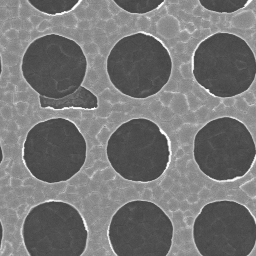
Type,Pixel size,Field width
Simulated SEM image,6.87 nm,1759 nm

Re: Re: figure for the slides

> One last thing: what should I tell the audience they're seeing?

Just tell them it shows holes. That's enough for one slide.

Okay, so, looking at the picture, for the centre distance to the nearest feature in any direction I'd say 548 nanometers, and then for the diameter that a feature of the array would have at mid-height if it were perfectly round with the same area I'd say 438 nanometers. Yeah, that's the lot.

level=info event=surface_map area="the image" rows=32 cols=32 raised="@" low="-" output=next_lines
@@@@-----@@@@@@-----@@@@@------@
@@@@@---@@@@@@@@---@@@@@@@@--@@@
@@@@@@@@@@@@@@@@@@@@@@@@@@@@@@@@
@@@@@@@@@@@@@@@@@@@@@@@@@@@@@@@@
@@@@@@--@@@@@@@@---@@@@@@@---@@@
@@@@------@@@@@-----@@@@@------@
@@@-------@@@@-------@@@--------
@@@--------@@--------@@@--------
@@@--------@@--------@@@--------
@@@--------@@@-------@@@--------
@@@@------@@@@-------@@@@------@
@@@@@------@@@@-----@@@@@@----@@
@@@@@-------@@@@@@@@@@@@@@@@@@@@
@@@@@@@-@@--@@@@@@@@@@@@@@@@@@@@
@@@@@@@@@@@@@@@@@@@@@@@@@@@@@@@@
@@@@@----@@@@@@----@@@@@@@----@@
@@@@------@@@@------@@@@@------@
@@@--------@@@-------@@@--------
@@@--------@@--------@@@--------
@@@--------@@--------@@@--------
@@@-------@@@@-------@@@@------@
@@@@------@@@@@-----@@@@@------@
@@@@@---@@@@@@@@---@@@@@@@@-@@@@
@@@@@@@@@@@@@@@@@@@@@@@@@@@@@@@@
@@@@@@@@@@@@@@@@@@@@@@@@@@@@@@@@
@@@@@----@@@@@@@---@@@@@@@----@@
@@@@------@@@@@-----@@@@@------@
@@@-------@@@@-------@@@--------
@@@--------@@@--------@@--------
@@@--------@@@--------@@--------
@@@--------@@@-------@@@--------
@@@@------@@@@-------@@@@------@